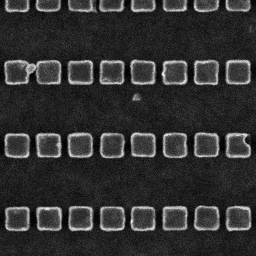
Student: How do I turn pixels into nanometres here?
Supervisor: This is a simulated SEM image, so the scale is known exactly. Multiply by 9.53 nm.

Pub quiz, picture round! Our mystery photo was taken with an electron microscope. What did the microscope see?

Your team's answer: a regular array of raised bodies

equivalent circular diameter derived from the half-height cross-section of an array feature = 26.4 pixels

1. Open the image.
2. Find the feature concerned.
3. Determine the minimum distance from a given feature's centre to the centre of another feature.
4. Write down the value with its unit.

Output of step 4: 298 nanometres